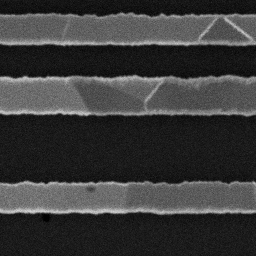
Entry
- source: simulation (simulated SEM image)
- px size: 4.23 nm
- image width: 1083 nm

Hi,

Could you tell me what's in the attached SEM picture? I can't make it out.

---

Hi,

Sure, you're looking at lines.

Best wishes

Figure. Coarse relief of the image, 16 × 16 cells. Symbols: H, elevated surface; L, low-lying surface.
LLLLLLLLLLLLLLLL
HHHHHHHHHHHHHHHH
HHHHHHHHHHHHHHHH
LLLLLLLLLLLLLLLL
LLLLLLLLLLLLLLLL
HHHHHHHHHHHHHHHH
HHHHHHHHHHHHHHHH
LLLLLLLLLLLLLLLL
LLLLLLLLLLLLLLLL
LLLLLLLLLLLLLLLL
LLLLLLLLLLLLLLLL
HHHHHHHHHHHHHHHH
HHHHHHHHHHHHHHHH
LLLLLLLLLLLLLLLL
LLLLLLLLLLLLLLLL
LLLLLLLLLLLLLLLL